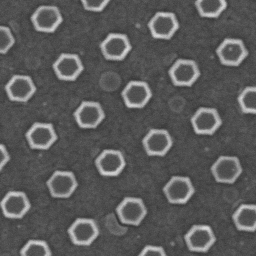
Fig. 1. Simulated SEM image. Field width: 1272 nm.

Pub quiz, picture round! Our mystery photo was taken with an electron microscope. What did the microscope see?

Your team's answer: a regular array of raised bodies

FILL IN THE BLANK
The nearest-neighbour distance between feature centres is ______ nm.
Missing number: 257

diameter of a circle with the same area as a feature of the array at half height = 130 nanometres